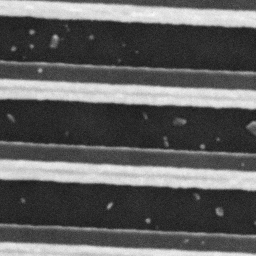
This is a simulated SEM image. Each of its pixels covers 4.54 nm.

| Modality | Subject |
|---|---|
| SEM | lines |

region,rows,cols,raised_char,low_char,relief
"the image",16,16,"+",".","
++++++++++++++++
...........+++++
................
................
+++++++++++++++.
++++++++++++++++
.........+++++++
................
................
+++++++++++++...
++++++++++++++++
.......+++++++++
................
................
++++++++++......
++++++++++++++++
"